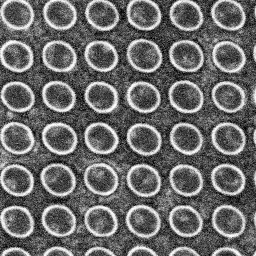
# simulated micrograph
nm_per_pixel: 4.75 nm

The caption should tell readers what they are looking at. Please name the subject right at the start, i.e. a regular array of raised bodies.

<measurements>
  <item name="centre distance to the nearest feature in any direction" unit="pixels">41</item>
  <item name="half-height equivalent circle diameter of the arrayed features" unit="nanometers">147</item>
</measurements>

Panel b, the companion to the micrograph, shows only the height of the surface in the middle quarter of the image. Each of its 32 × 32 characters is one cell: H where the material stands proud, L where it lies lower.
HHLLLLLHHHHHHLLLLHHHHHHHLLLLHHHH
HLLLLLLLLHHLLLLLLLLHHHLLLLLLLLHH
LLLLLLLLLLLLLLLLLLLLLLLLLLLLLLLL
LLLLLLLLLLLLLLLLLLLLLLLLLLLLLLLL
LLLLLLLLLLLLLLLLLLLLLLLLLLLLLHHL
HLLLLLHHHHHLLLLLLHHHHHLLLLLHHHHH
HHLLLLHHHHHHHLLLHHHHHHHLLLLHHHHH
HHLLLLHHHHHHHLLLHHHHHHHHLLLHHHHH
HHHLLLHHHHHHHLLLHHHHHHHHLLLHHHHH
HHHLLLHHHHHHHLLLHHHHHHHHLLLHHHHH
HHLLLLLHHHHHHLLLLHHHHHHLLLLLHHHH
HLLLLLLLHHHHLLLLLLLHHHLLLLLLLHHH
LLLLLLLLLLLLLLLLLLLLLLLLLLLLLLLL
LLLLLLLLLLLLLLLLLLLLLLLLLLLLLLLL
LLLLLLLLLLLLLLLLLLLLLLLLLLLLLLLL
HLLLLLLHHHHLLLLLLLHHHLLLLLLLHHHH
HHLLLLHHHHHHLLLLLHHHHHHLLLLHHHHH
HHHLLLHHHHHHHLLLHHHHHHHHLLLHHHHH
HHHLLLHHHHHHHLLLHHHHHHHHLLLHHHHH
HHHLLLHHHHHHHLLLHHHHHHHHLLLHHHHH
HHHLLLHHHHHHHLLLLHHHHHHHLLLLHHHH
HHLLLLLHHHHHLLLLLLHHHHHLLLLLLHHH
LLLLLLLLLLLLLLLLLLLLHHLLLLLLLLLL
LLLLLLLLLLLLLLLLLLLLLLLLLLLLLLLL
LLLLLLLLLLLLLLLLLLLLLLLLLLLLLLLL
LLLLLLLHHHHLLLLLLLHHHLLLLLLLLHHL
HLLLLLHHHHHHLLLLLHHHHHHLLLLHHHHH
HHLLLHHHHHHHHLLLHHHHHHHLLLLHHHHH
HHHLLHHHHHHHHLLLHHHHHHHHLLLHHHHH
HHHLLLHHHHHHHLLLHHHHHHHHLLLHHHHH
HHHLLLHHHHHHHLLLLHHHHHHHLLLHHHHH
HHLLLLLHHHHHHLLLLHHHHHHHLLLLHHHH